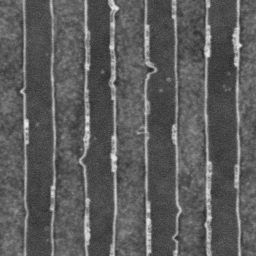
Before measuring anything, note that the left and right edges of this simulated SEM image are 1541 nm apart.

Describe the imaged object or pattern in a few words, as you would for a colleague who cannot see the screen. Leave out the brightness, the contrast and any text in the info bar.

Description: one or a few lines or trenches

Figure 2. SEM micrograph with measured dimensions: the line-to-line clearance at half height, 181 nanometers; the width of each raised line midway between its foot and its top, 186 nm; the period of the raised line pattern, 368 nm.